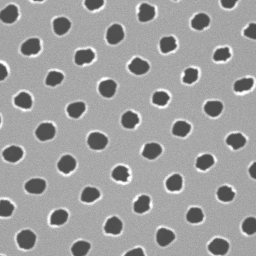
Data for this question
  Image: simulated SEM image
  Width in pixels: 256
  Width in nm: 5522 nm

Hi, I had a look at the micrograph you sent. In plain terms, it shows a regular array of holes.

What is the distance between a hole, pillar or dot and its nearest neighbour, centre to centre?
806 nanometers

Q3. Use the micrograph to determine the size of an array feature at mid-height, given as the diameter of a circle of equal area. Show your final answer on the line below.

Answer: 390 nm